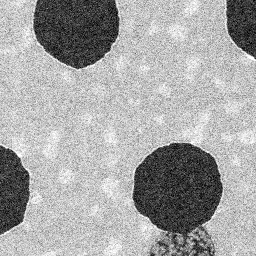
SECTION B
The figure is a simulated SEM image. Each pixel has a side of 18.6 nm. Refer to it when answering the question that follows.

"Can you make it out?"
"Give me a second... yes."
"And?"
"raised bodies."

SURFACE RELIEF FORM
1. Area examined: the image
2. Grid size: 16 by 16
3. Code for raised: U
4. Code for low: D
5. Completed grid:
DDUUUUUDDDDDDDUU
DDUUUUUDDDDDDDUU
DDUUUUUDDDDDDDUU
DDDUUUUDDDDDDDDD
DDDDDDDDDDDDDDDD
DDDDDDDDDDDDDDDD
DDDDDDDDDDDDDDDD
DDDDDDDDDDDDDDDD
DDDDDDDDDDDDDDDD
UDDDDDDDDUUUUDDD
UUDDDDDDDUUUUUDD
UUDDDDDDUUUUUUDD
UUDDDDDDUUUUUUDD
UUDDDDDDDUUUUDDD
DDDDDDDDDDUUUDDD
DDDDDDDDDUUUUDDD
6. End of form